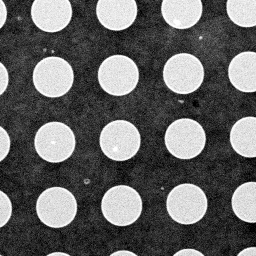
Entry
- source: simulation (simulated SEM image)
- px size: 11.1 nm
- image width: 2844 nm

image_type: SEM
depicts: an array of small figures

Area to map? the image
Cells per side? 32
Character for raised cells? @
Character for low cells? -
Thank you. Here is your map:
----@@@@@---@@@@@---@@@@@---@@@@
@---@@@@@---@@@@@---@@@@@---@@@@
@---@@@@@---@@@@@----@@@@----@@@
-----@@@------@@------@---------
--------------------------------
--------------------------------
--------------------------------
-----@@@-----@@@-----@@@@----@@@
@---@@@@@---@@@@@----@@@@----@@@
@---@@@@@---@@@@@---@@@@@----@@@
@---@@@@@----@@@@----@@@@----@@@
-----@@@-----@@@------@@--------
--------------------------------
--------------------------------
--------------------------------
------@@------@@-----@@@@----@@@
@----@@@@----@@@@----@@@@----@@@
@---@@@@@----@@@@----@@@@@---@@@
@---@@@@@----@@@@----@@@@----@@@
@----@@@@----@@@@-----@@-------@
--------------------------------
--------------------------------
--------------------------------
------@@------@@------@@@-----@@
@----@@@@----@@@@----@@@@@---@@@
@----@@@@----@@@@@---@@@@@---@@@
@----@@@@----@@@@@---@@@@@---@@@
@----@@@@-----@@@-----@@@-----@@
--------------------------------
--------------------------------
--------------------------------
---------------@------@@@-----@@